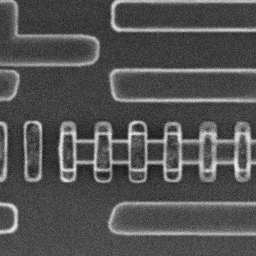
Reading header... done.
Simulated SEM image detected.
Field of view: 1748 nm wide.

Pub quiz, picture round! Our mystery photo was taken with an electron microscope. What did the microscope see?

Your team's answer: wiring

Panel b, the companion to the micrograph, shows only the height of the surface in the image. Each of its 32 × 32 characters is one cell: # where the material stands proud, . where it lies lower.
##............##################
##............##################
##............##################
##............##################
##..............................
############....................
############....................
############....................
................................
##............##################
##............##################
##............##################
...............################.
................................
................................
....#............#...#..........
#..##...#...##..##...#...##...#.
#..##...##..##..###.###..##..##.
#..##...########################
#..##...########################
#..##...##.###..###.###..##..##.
#..##...#...##..##...##..##...#.
............##...#..............
................................
................................
.................#####..........
##............##################
##............##################
##............##################
................................
................................
................................